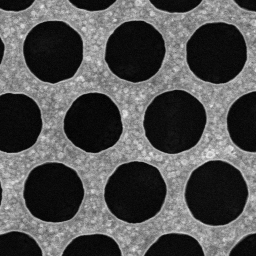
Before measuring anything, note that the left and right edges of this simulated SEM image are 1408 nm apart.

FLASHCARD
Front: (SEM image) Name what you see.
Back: a regular array of holes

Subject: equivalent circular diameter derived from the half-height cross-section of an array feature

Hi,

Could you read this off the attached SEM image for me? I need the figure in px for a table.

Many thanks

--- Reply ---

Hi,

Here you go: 61.5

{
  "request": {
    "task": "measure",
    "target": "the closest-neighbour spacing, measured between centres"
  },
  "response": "443 nm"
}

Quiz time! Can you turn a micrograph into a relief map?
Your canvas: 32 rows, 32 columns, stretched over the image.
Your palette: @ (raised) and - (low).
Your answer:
----@@@@@-----@@@@@------@@@@@--
@@@@@@@@@@@@@@@@@@@@@--@@@@@@@@@
@@@@@@@@@@@@@@@@@@@@@@@@@@@@@@@@
@@@@-----@@@@@@----@@@@@@-----@@
@@@-------@@@@------@@@@------@@
@@@-------@@@--------@@--------@
-@@-------@@@--------@@--------@
@@@-------@@@-------@@@--------@
@@@@------@@@@------@@@@------@@
@@@@-----@@@@@@----@@@@@@-----@@
@@@@@@@@@@@@@@@@@@@@@@@@@@@@@@@@
@@@@@@@@@@@@@@@@@@@@@--@@@@@@@@-
----@@@@@-----@@@@@------@@@@@--
-----@@@@------@@@--------@@@---
-----@@@-------@@@--------@@----
-----@@@-------@@@--------@@----
-----@@@-------@@@-------@@@@---
-----@@@@------@@@@------@@@@---
----@@@@@@----@@@@@-----@@@@@@--
@@@@@@@@@@@@@@@@@@@@@@@@@@@@@@@@
@@@@@---@@@@@@@---@@@@@@@----@@@
@@@@-----@@@@@------@@@@------@@
@@@-------@@@-------@@@@-------@
@@@-------@@@--------@@--------@
@@@-------@@@--------@@--------@
@@@-------@@@-------@@@--------@
@@@@------@@@@------@@@@------@@
@@@@@----@@@@@@---@@@@@@@----@@@
@@@@@@@@@@@@@@@@@@@@@@@@@@@@@@@@
----@@@@@@---@@@@@@@----@@@@@@@-
-----@@@@------@@@@------@@@@@--
-----@@@-------@@@-------@@@@---